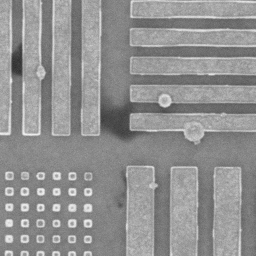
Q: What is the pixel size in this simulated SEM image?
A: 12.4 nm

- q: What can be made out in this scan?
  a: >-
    groups of lines, slits or small figures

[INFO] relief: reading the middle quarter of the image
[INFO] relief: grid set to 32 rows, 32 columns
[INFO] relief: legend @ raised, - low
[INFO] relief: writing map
@----@@@@--------@@@@@@@@@@@@@@@
@----@@@@--------@@@@@@@@@@@@@@@
@----@@@@-----------------------
@----@@@@-----------------------
@----@@@@-----------------------
@----@@@@-----------------------
@----@@@@--------@@@@@@@@@@@@@@@
@----@@@@--------@@@@@@@@@@@@@@@
@----@@@@--------@@@@@@@@@@@@@@@
@----@@@@------------@@@@@@@@@@@
@----@@@@----------------@------
@----@@@@-----------------------
@----@@@@-----------------------
@----@@@@--------@@@@@@@@@@@@@@@
@----@@@@--------@@@@@@@@@@@@@@@
@----@@@@--------@@@@@@@@@@@@@@@
@----@@@@---------@@@@@@@@----@@
@----@@@@---------------------@@
-------------------------------@
--------------------------------
--------------------------------
--------------------------------
--------------------------------
--------------------------------
--------------------------------
--------------------------------
----------------@@@@@@-----@@@@@
-@@--@@---------@@@@@@-----@@@@@
-@@--@@---------@@@@@@-----@@@@@
----------------@@@@@@-----@@@@@
----------------@@@@@@@----@@@@@
--@--@@---------@@@@@@-----@@@@@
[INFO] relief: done